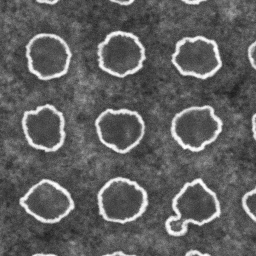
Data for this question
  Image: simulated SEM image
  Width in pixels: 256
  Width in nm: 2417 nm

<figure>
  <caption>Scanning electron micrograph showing a regular array of raised bodies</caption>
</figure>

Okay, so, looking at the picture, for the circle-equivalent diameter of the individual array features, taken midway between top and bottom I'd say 415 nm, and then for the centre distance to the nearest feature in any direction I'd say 673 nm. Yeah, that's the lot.